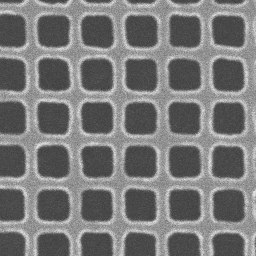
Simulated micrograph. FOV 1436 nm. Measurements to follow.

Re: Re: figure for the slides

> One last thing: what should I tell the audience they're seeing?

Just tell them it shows a regular array of holes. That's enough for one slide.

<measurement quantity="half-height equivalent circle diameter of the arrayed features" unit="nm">199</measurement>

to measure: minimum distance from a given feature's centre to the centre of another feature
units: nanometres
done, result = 243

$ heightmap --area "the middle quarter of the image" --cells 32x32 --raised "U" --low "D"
DUUUDDDDDDDDUUUDDDDDDDDUUUDDDDDD
DUUUDDDDDDDDUUUDDDDDDDDUUUDDDDDD
DDUUDDDDDDDDUUUDDDDDDDDUUUDDDDDD
DDUUDDDDDDDDUUUDDDDDDDDUUUDDDDDD
DDUUDDDDDDDDUUUDDDDDDDDUUUDDDDDD
DUUUDDDDDDDDUUUUDDDDDDDUUUDDDDDD
DUUUUDDDDDDDUUUUDDDDDDDUUUUDDDDD
UUUUUUUUUUUUUUUUUUUUUUUUUUUUUUUU
UUUUUUUUUUUUUUUUUUUUUUUUUUUUUUUU
UUUUUDDDDDDUUUUUUUDDUUUUUUUDDDUU
DUUUDDDDDDDDUUUUDDDDDDDUUUDDDDDD
DUUUDDDDDDDDUUUDDDDDDDDUUUDDDDDD
DUUUDDDDDDDDDUUDDDDDDDDDUUDDDDDD
DUUUDDDDDDDDUUUDDDDDDDDDUUDDDDDD
DUUUDDDDDDDDDUUDDDDDDDDUUUDDDDDD
DUUUDDDDDDDDDUUDDDDDDDDUUUDDDDDD
DUUUUDDDDDDDUUUDDDDDDDDUUUDDDDDD
UUUUUUUUUDDUUUUUDDDDDDUUUUUUDDDD
UUUUUUUUUUUUUUUUUUUUUUUUUUUUUUUU
UUUUUUUUUUUUUUUUUUUUUUUUUUUUUUUU
UUUUUDDDDDDUUUUUDDDDDDUUUUUDDDDD
DUUUDDDDDDDDUUUDDDDDDDDUUUDDDDDD
DUUUDDDDDDDDUUUDDDDDDDDUUUDDDDDD
DUUUDDDDDDDDDUUDDDDDDDDUUUDDDDDD
DUUUDDDDDDDDDUUDDDDDDDDUUUDDDDDD
DDUUUDDDDDDDDUUDDDDDDDDUUUDDDDDD
DDUUDDDDDDDDDUUDDDDDDDDUUUDDDDDD
DUUUUDDDDDDDUUUDDDDDDDDUUUDDDDDD
UUUUUUDDDUUUUUUUUUUUUDUUUUUUDDUU
UUUUUUUUUUUUUUUUUUUUUUUUUUUUUUUU
UUUUUUUUUUUUUUUUUUUUUUUUUUUUUUUU
UUUUUDDDDDDUUUUUDDDDDDUUUUUDDDDD